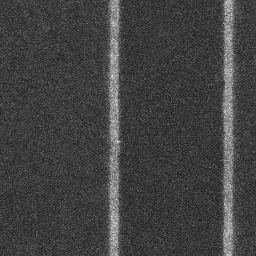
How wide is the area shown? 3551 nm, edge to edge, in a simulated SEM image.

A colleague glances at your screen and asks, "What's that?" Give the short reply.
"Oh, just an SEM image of one or a few lines or trenches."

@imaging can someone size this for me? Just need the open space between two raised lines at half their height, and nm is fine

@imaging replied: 1560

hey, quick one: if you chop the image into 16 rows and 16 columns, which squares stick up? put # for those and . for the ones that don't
#######.......##
#######.......##
#######.......##
#######.......##
#######.......##
#######.......##
#######.......##
#######.......##
#######.......##
#######.......##
#######.......##
#######.......##
#######.......##
#######.......##
#######.......##
#######.......##